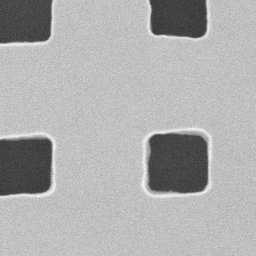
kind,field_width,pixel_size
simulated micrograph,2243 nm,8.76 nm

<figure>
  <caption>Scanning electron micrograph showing holes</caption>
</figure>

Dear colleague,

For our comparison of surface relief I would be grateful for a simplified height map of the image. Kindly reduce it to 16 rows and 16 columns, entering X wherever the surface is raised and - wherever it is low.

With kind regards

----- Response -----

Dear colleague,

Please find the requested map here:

---XXXXXX----XXX
---XXXXXX----XXX
---XXXXXXXXXXXXX
XXXXXXXXXXXXXXXX
XXXXXXXXXXXXXXXX
XXXXXXXXXXXXXXXX
XXXXXXXXXXXXXXXX
XXXXXXXXXXXXXXXX
XXXXXXXXXX---XXX
---XXXXXX----XXX
---XXXXXX----XXX
---XXXXXX----XXX
XXXXXXXXXXXXXXXX
XXXXXXXXXXXXXXXX
XXXXXXXXXXXXXXXX
XXXXXXXXXXXXXXXX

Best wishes